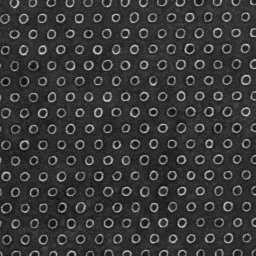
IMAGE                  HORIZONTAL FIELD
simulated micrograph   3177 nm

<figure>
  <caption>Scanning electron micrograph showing a regular array of raised bodies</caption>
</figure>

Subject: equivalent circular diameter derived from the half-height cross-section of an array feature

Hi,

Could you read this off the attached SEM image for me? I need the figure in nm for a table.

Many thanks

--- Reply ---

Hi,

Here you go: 103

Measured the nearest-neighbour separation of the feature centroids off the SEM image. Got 222 nanometres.